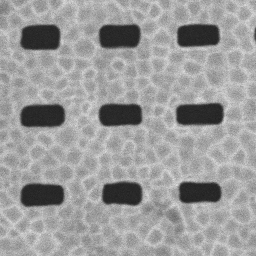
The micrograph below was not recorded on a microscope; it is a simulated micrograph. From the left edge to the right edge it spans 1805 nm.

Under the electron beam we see a regular array of holes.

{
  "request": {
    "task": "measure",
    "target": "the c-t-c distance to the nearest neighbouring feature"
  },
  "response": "550 nanometers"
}